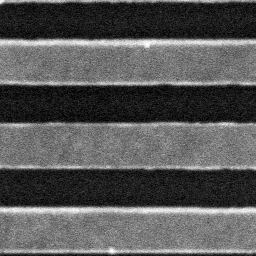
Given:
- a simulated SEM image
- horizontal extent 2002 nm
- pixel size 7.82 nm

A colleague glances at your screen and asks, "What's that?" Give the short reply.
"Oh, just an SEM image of lines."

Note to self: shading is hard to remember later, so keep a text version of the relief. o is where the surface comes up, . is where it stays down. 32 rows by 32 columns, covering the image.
................................
................................
................................
................................
................................
oooooooooooooooooooooooooooooooo
oooooooooooooooooooooooooooooooo
oooooooooooooooooooooooooooooooo
oooooooooooooooooooooooooooooooo
oooooooooooooooooooooooooooooooo
..oooooooooooooooooo.ooooooo..oo
................................
................................
................................
................................
......oo.o........ooooooo.oooo.o
oooooooooooooooooooooooooooooooo
oooooooooooooooooooooooooooooooo
oooooooooooooooooooooooooooooooo
oooooooooooooooooooooooooooooooo
oooooooooooooooooooooooooooooooo
................................
................................
................................
................................
................................
oooooooooooooooooooooooooooooooo
oooooooooooooooooooooooooooooooo
oooooooooooooooooooooooooooooooo
oooooooooooooooooooooooooooooooo
oooooooooooooooooooooooooooooooo
oooooooooooooooooooooooooooooooo